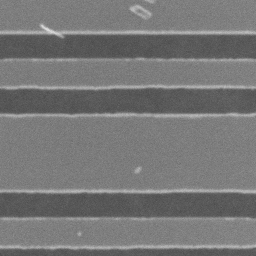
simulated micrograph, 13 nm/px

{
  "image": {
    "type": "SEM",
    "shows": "lines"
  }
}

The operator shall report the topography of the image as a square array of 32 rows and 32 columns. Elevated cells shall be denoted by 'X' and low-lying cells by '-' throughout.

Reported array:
XXXXXXXXXXXXXXXXXXXXXXXXXXXXXXXX
XXXXXXXXXXXXXXXXXXXXXXXXXXXXXXXX
XXXXXXXXXXXXXXXXXXXXXXXXXXXXXXXX
XXXXXXXXXXXXXXXXXXXXXXXXXXXXXXXX
--------------------------------
--------------------------------
--------------------------------
XXXXXXXXXXXXXXXXXXXXXXXXXXXXXXXX
XXXXXXXXXXXXXXXXXXXXXXXXXXXXXXXX
XXXXXXXXXXXXXXXXXXXXXXXXXXXXXXXX
XXXXXXXXXXXXXXXXXXXXXXXXXXXXXXXX
--------------------------------
--------------------------------
--------------------------------
XXXXXXXXXXXXXXXXXXXXXXXXXXXXXXXX
XXXXXXXXXXXXXXXXXXXXXXXXXXXXXXXX
XXXXXXXXXXXXXXXXXXXXXXXXXXXXXXXX
XXXXXXXXXXXXXXXXXXXXXXXXXXXXXXXX
XXXXXXXXXXXXXXXXXXXXXXXXXXXXXXXX
XXXXXXXXXXXXXXXXXXXXXXXXXXXXXXXX
XXXXXXXXXXXXXXXXXXXXXXXXXXXXXXXX
XXXXXXXXXXXXXXXXXXXXXXXXXXXXXXXX
XXXXXXXXXXXXXXXXXXXXXXXXXXXXXXXX
XXXXXXXXXXXXXXXXXXXXXXXXXXXXXXXX
--------------------------------
--------------------------------
--------------------------------
XXXXXXXXXXXXXXXXXXXXXXXXXXXXXXXX
XXXXXXXXXXXXXXXXXXXXXXXXXXXXXXXX
XXXXXXXXXXXXXXXXXXXXXXXXXXXXXXXX
XXXXXXXXXXXXXXXXXXXXXXXXXXXXXXXX
--------------------------------